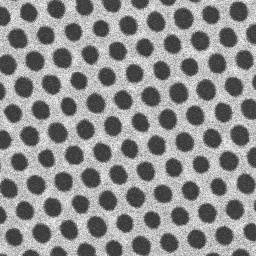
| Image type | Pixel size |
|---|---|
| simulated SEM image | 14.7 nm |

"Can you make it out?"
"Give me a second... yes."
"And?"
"a regular array of holes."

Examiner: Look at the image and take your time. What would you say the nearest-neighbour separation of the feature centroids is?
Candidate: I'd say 405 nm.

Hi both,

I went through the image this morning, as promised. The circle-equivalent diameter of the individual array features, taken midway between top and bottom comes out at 292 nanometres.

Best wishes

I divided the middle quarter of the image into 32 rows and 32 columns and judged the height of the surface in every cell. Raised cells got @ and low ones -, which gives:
--@@@@@@@@@@@@@@---@@@----@@@---
@@@@@@@@@---@@@-----@@-----@@---
@@---@@@-----@@-----@@-----@@@--
@@----@@-----@@-----@@@---@@@@@@
@@----@@@----@@@---@@@@@@@@@-@@@
@@----@@@@--@@@@@@@@@@@@@@@----@
@@@--@@@@@@@@@--@@@@---@@@-----@
@@@@@@@--@@@@---@@@-----@@-----@
--@@@@----@@-----@@-----@@@----@
---@@-----@@@----@@@----@@@---@@
---@@@----@@@----@@@@--@@@@@@@@@
---@@@----@@@@@-@@@@@@@@@--@@@@-
---@@@@@-@@@@@@@@---@@@@----@@--
@@@@@@@@@@@--@@@@----@@@----@@@-
@@@@---@@@----@@@----@@@----@@@-
@@@----@@@-----@@----@@@----@@@@
-@@-----@@----@@@@---@@@@--@@@@@
-@@-----@@@---@@@@@@@@@@@@@@----
-@@@---@@@@@@@@@@@@@@----@@@----
@@@@@@@@@@@@@@@---@@@----@@@----
@---@@@----@@@----@@@-----@@----
----@@@-----@@-----@@-----@@@---
-----@@-----@@@----@@@---@@@@@@@
-----@@@----@@@@--@@@@@@@@@@@@@@
@----@@@@--@@@@@@@@--@@@@----@@@
@@@@@@@@@@@@---@@@----@@@-----@@
@@@@@---@@@----@@@-----@@-----@@
--@@-----@@-----@@-----@@@---@@@
--@@-----@@-----@@@----@@@@-@@@@
--@@-----@@@----@@@@@@@@@@@@@@--
--@@@----@@@@@@@@@@@@@@---@@@---
--@@@@@@@@-@@@@@----@@-----@@---